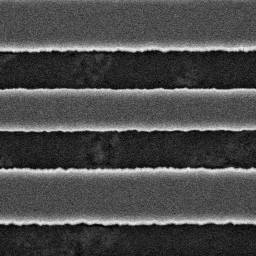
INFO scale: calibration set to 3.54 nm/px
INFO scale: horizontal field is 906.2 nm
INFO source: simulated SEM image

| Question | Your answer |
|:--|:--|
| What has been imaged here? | lines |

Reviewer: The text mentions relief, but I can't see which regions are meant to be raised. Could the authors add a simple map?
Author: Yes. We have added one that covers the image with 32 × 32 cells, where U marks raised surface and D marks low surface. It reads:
UUUUUUUUUUUUUUUUUUUUUUUUUUUUUUUU
UUUUUUUUUUUUUUUUUUUUUUUUUUUUUUUU
UUUUUUUUUUUUUUUUUUUUUUUUUUUUUUUU
UUUUUUUUUUUUUUUUUUUUUUUUUUUUUUUU
UUUUUUUUUUUUUUUUUUUUUUUUUUUUUUUU
UUUUUUUUUUUUUUUUUUUUUUUUUUUUUUUU
DDDDDDDDDDDDDDDDDDDDDDDDDDDDDDDD
DDDDDDDDDDDDDDDDDDDDDDDDDDDDDDDD
DDDDDDDDDDDDDDDDDDDDDDDDDDDDDDDD
DDDDDDDDDDDDDDDDDDDDDDDDDDDDDDDD
DDDDDDDDDDDDDDDDDDDDDDDDDDDDDDDD
UUUUUUUUUUUUUUUUUUUUUUUUUUUUUUUU
UUUUUUUUUUUUUUUUUUUUUUUUUUUUUUUU
UUUUUUUUUUUUUUUUUUUUUUUUUUUUUUUU
UUUUUUUUUUUUUUUUUUUUUUUUUUUUUUUU
UUUUUUUUUUUUUUUUUUUUUUUUUUUUUUUU
DDDDDDDDDDDDDDDDDDDDDDDDDDDDDDDD
DDDDDDDDDDDDDDDDDDDDDDDDDDDDDDDD
DDDDDDDDDDDDDDDDDDDDDDDDDDDDDDDD
DDDDDDDDDDDDDDDDDDDDDDDDDDDDDDDD
DDDDDDDDDDDDDDDDDDDDDDDDDDDDDDDD
UUUUUUUUUUUUUUUUUUUUUUUUUUUUUUUU
UUUUUUUUUUUUUUUUUUUUUUUUUUUUUUUU
UUUUUUUUUUUUUUUUUUUUUUUUUUUUUUUU
UUUUUUUUUUUUUUUUUUUUUUUUUUUUUUUU
UUUUUUUUUUUUUUUUUUUUUUUUUUUUUUUU
UUUUUUUUUUUUUUUUUUUUUUUUUUUUUUUU
UUUUUUUUUUUUUUUUUUUUUUUUUUUUUUUU
DDDDDDDDDDDDDDDDDDDDDDDDDDDDDDDD
DDDDDDDDDDDDDDDDDDDDDDDDDDDDDDDD
DDDDDDDDDDDDDDDDDDDDDDDDDDDDDDDD
DDDDDDDDDDDDDDDDDDDDDDDDDDDDDDDD